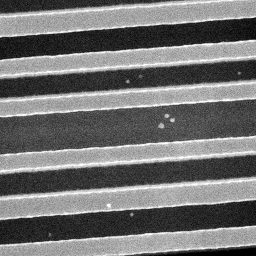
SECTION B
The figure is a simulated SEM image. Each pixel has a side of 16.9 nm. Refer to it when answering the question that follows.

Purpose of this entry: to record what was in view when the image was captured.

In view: lines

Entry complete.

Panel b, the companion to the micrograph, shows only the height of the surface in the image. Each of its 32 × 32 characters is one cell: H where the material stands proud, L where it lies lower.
LLLLLLLLLLLLLLLLLLLLLLHHHHHHHHHH
LLLLLLLLLHHHHHHHHHHHHHHHHHHHHHHH
HHHHHHHHHHHHHHHHHHHHHHHHHHHLLLLL
HHHHHHHHHHHHHHHLLLLLLLLLLLLLLLLL
LLLLLLLLLLLLLLLLLLLLLLLLLLLLLLLL
LLLLLLLLLLLLLLLLLLLLLLLLLLLHHHHH
LLLLLLLLLLLLHHHHHHHHHHHHHHHHHHHH
HHHHHHHHHHHHHHHHHHHHHHHHHHLLLLLL
HHHHHHHHHHHHHLLLLLLLLLLLLLLLLLLL
LLLLLLLLLLLLLLLLLLLLLLLLLLLLLLLL
LLLLLLLLLLLLLLLLLLLLLLLLLLLLLHHH
LLLLLLLLLLLLLLLHHHHHHHHHHHHHHHHH
LLHHHHHHHHHHHHHHHHHHHHHHHHHHHLLL
HHHHHHHHHHHHHHHLLLLLLLLLLLLLLLLL
HLLLLLLLLLLLLLLLLLLLLLLLLLLLLLLL
LLLLLLLLLLLLLLLLLLLLLLLLLLLLLLLL
LLLLLLLLLLLLLLLLLLLLLLLLLLLLLLLL
LLLLLLLLLLLLLLLLLLLLLLLLLLHHHHHH
LLLLLLLLLLLLLHHHHHHHHHHHHHHHHHHH
HHHHHHHHHHHHHHHHHHHHHHHHHHLLLLLL
HHHHHHHHHHHLLLLLLLLLLLLLLLLLLLLL
LLLLLLLLLLLLLLLLLLLLLLLLLLLLLLLL
LLLLLLLLLLLLLLLLLLLLLLLLLLLLLLLH
LLLLLLLLLLLLLLLLLHHHHHHHHHHHHHHH
LLLLLHHHHHHHHHHHHHHHHHHHHHHHHHHH
HHHHHHHHHHHHHHHHHHHHHHHHLLLLLLLL
HHHHHHHHHHHLLLLLLLLLLLLLLLLLLLLL
LLLLLLLLLLLLLLLLLLLLLLLLLLLLLLLL
LLLLLLLLLLLLLLLLLLLLLLLLLLLLLHHH
LLLLLLLLLLLLLLLLHHHHHHHHHHHHHHHH
LLLHHHHHHHHHHHHHHHHHHHHHHHHHHHHH
HHHHHHHHHHHHHHHHHHHHLLLLLLLLLLLL